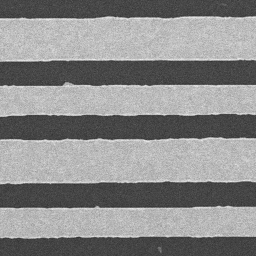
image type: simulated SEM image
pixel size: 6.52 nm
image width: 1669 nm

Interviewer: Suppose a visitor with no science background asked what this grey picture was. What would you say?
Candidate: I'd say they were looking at lines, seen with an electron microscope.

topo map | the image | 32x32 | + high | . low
................................
................................
++++++++++++++++++++++++++++++++
++++++++++++++++++++++++++++++++
++++++++++++++++++++++++++++++++
++++++++++++++++++++++++++++++++
++++++++++++++++++++++++++++++++
++++++..........................
................................
................................
................................
++++++++++++++++++++++++++++++++
++++++++++++++++++++++++++++++++
++++++++++++++++++++++++++++++++
+...............................
................................
................................
+++.....++.+++++++..++++++++++++
++++++++++++++++++++++++++++++++
++++++++++++++++++++++++++++++++
++++++++++++++++++++++++++++++++
++++++++++++++++++++++++++++++++
++++++++++++++++++++++++++++++++
................................
................................
................................
++++++++++++++++++++++++++++++++
++++++++++++++++++++++++++++++++
++++++++++++++++++++++++++++++++
++++++++++++++++++..+...+++.....
................................
................................